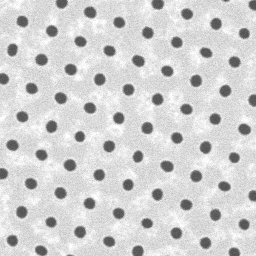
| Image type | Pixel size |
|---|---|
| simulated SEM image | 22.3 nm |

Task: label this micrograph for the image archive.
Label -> a regular array of holes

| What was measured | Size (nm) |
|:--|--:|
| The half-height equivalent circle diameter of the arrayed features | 279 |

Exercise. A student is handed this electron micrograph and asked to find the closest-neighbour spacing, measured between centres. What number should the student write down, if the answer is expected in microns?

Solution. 0.667